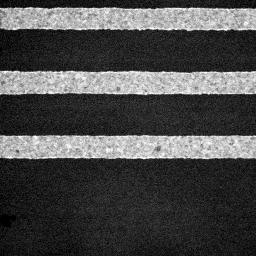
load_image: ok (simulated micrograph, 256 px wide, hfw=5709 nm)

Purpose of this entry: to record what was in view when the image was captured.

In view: one or a few lines or trenches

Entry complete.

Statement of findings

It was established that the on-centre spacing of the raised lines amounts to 1430 nm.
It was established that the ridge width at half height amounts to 0.477 microns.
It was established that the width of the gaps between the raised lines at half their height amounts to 954 nanometres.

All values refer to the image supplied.